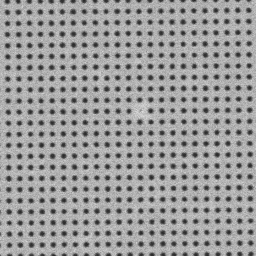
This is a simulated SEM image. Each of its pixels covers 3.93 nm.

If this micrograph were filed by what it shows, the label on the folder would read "a regular array of holes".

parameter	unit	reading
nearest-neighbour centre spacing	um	0.0427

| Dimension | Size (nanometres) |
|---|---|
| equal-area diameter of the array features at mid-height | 19.3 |